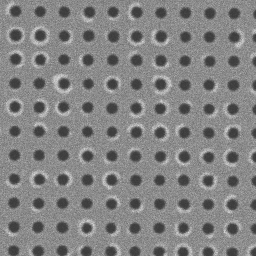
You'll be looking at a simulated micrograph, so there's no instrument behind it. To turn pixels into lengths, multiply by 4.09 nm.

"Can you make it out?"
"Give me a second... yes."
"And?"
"a regular array of holes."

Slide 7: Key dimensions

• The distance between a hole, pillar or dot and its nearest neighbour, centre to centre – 96.2 nanometers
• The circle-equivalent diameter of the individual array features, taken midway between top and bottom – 11.3 px